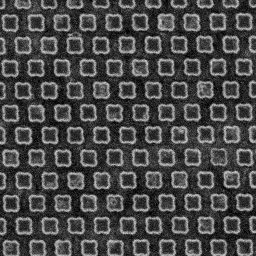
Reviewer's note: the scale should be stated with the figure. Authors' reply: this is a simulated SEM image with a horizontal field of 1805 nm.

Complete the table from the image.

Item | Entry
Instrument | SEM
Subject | a regular array of raised bodies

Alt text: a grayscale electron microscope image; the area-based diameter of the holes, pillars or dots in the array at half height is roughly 117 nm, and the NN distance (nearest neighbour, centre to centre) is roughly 181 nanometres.